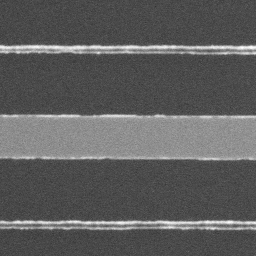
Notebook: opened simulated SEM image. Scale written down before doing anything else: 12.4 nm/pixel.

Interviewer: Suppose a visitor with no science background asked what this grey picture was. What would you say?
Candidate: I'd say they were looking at lines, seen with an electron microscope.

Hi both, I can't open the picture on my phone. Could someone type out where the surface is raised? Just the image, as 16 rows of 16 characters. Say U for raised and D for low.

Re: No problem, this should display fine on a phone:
DDDDDDDDDDDDDDDD
DDDDDDDDDDDDDDDD
DDDDDDDDDDDDDDDD
DDDDDDDDDDDDDDDD
DDDDDDDDDDDDDDDD
DDDDDDDDDDDDDDDD
DDDDDDDDDDDDDDDD
UUUUUUUUUUUUUUUU
UUUUUUUUUUUUUUUU
UUUUUUUUUUUUUUUU
DDDDDDDDDDDDDDDD
DDDDDDDDDDDDDDDD
DDDDDDDDDDDDDDDD
DDDDDDDDDDDDDDDD
DDDDDDDDDDDDDDDD
DDDDDDDDDDDDDDDD